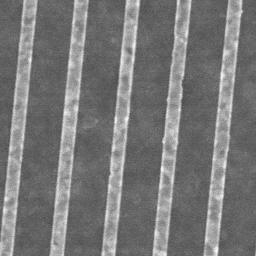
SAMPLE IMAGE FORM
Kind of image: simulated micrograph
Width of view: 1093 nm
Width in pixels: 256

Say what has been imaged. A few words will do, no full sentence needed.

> parallel lines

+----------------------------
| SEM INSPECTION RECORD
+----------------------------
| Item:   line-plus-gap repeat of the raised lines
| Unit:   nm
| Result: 217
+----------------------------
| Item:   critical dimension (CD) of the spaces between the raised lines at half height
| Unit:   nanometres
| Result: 162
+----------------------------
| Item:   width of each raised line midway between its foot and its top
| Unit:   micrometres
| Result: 0.0579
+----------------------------